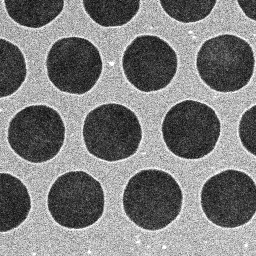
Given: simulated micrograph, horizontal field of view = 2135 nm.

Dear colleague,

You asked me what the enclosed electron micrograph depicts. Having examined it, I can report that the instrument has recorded a regular array of holes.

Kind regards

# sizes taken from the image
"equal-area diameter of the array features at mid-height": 483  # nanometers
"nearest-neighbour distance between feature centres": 630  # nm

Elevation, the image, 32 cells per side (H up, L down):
HLLLLLLLHHLLLLLLLLHHLLLLLLLHHHLL
HLLLLLLLHHHLLLLLLHHHHLLLLLHHHHLL
HHLLLLLHHHHHLLLLHHHHHHLLLHHHHHHH
HHHHLHHHHHHHHHHHHHHHHHHHHHHHHHHH
HHHHHHHHHHHHHHHHHHLHHHHHHHHLLHHH
LLHHHHHLLLLLHHHHLLLLLHHHHLLLLLLH
LLLHHHLLLLLLHHHHLLLLLLHHHLLLLLLL
LLLHHHLLLLLLLHHLLLLLLLHHHLLLLLLL
LLLHHHLLLLLLLHHLLLLLLLHHHLLLLLLL
LLLHHHLLLLLLHHHHLLLLLLHHHLLLLLLH
LLLHHHHLLLLLHHHHHLLLLHHHHHLLLLLH
LLHHHHHHLLLHHHHHHHHHHHHHHHHHLHHH
HHHHHHHHHHHHHHHHHHHHHHHHHHHHHHHH
HHHLLLHHHHHHLLLLHHHHHLLLLLHHHHHL
HHLLLLLHHHHLLLLLLHHHHLLLLLLHHHLL
HLLLLLLLHHLLLLLLLHHHLLLLLLLLHHLL
HLLLLLLLHHLLLLLLLLHHLLLLLLLLHHLL
HLLLLLLLHHLLLLLLLLHHLLLLLLLHHHLL
HLLLLLLLHHHLLLLLLHHHHLLLLLLHHHHL
HHLLLLLHHHHHLLLLHHHHHHLLLLHHHHHH
HHHHHHHHHHHHHHHHHHHHHHHHHHHHHHHH
HHHHHHHHHLLHHHHHHLLLLHHHHHHHLLHH
LLHHHHHLLLLLHHHHLLLLLLHHHHLLLLLL
LLLHHHLLLLLLLHHHLLLLLLLHHLLLLLLL
LLLLHHLLLLLLLHHLLLLLLLLHHLLLLLLL
LLLLHHLLLLLLLHHLLLLLLLLHHLLLLLLL
LLLLHHLLLLLLLHHHLLLLLLHHHLLLLLLL
LLLHHHHLLLLLHHHHLLLLLLHHHHLLLLLH
LLHHHHHHHLHHHHHHHHLLHHHHHHHHHHHH
HHHHHHHHHHHHHHHHHHHHHHHHHHHHHHHH
HHHHHHHHHHHHHHHHHHHHHHHHHHHHHHHH
HHHHHHHHHHHHHHHHHHHHHHHHHHHHHHHH